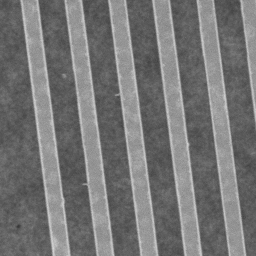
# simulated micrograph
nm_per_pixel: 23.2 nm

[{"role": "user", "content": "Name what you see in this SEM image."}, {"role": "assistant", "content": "parallel lines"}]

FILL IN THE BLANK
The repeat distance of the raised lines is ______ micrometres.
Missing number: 1.01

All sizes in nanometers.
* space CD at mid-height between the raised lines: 654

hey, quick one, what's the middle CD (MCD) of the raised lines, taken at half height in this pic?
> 357 nm